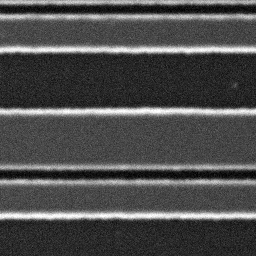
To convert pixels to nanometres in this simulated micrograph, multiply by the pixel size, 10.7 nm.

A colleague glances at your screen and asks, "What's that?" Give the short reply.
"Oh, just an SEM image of lines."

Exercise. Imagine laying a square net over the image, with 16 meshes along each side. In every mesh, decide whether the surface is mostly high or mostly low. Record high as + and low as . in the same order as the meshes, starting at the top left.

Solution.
++++++++++++++++
++++++++++++++++
++++++++++++++++
................
................
................
................
++++++++++++++++
++++++++++++++++
++++++++++++++++
++++++++++++++++
++++++++++++++++
++++++++++++++++
++++++++++++++++
................
................